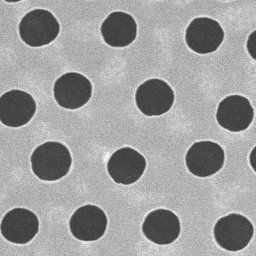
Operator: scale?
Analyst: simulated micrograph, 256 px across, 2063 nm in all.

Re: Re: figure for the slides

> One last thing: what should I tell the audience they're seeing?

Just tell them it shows a regular array of holes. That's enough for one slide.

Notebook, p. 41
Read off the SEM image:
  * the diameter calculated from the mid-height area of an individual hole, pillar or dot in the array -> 303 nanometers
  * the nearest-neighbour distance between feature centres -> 573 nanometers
